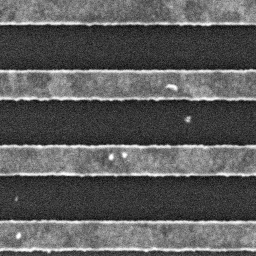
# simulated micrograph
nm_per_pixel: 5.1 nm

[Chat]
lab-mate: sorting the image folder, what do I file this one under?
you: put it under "lines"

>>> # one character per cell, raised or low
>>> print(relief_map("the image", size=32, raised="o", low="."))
oooooooooooooooooooooooooooooooo
oooooooooooooooooooooooooooooooo
oooooooooooooooooooooooooooooooo
................................
................................
................................
................................
................................
................................
oooooooooooooooooooooooooooooooo
oooooooooooooooooooooooooooooooo
oooooooooooooooooooooooooooooooo
................................
................................
................................
................................
................................
................................
oooooooooooooooooooooooooooooooo
oooooooooooooooooooooooooooooooo
oooooooooooooooooooooooooooooooo
oooooooooooooooooooooooooooooooo
................................
................................
................................
................................
................................
................................
oooooooooooooooooooooooooooooooo
oooooooooooooooooooooooooooooooo
oooooooooooooooooooooooooooooooo
................................